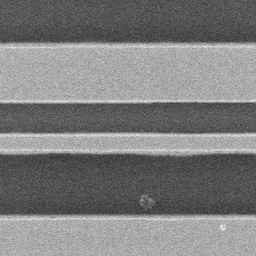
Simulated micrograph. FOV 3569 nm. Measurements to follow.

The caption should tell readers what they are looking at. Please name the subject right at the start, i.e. lines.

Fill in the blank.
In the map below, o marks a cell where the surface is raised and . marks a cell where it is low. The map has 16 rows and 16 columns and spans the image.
................
................
................
oooooooooooooooo
oooooooooooooooo
oooooooooooooooo
oooooooooooooooo
oooooooooooooooo
oooooooooooooooo
................
................
................
................
................
oooooooooooooooo
oooooooooooooooo